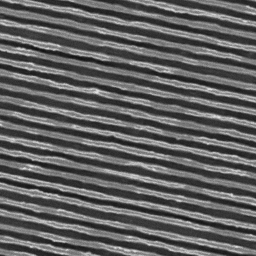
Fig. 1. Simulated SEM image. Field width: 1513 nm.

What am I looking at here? parallel lines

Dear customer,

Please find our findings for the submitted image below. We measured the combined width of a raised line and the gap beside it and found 73.5 nanometers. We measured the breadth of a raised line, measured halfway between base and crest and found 31.8 nanometres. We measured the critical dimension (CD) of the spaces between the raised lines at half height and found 0.0427 um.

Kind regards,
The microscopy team